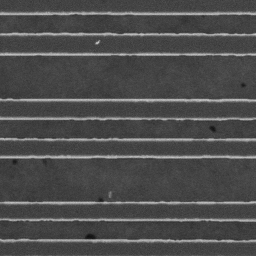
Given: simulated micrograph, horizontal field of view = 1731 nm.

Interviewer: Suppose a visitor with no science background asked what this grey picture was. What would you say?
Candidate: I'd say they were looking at lines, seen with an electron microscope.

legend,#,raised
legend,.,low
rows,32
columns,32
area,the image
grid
################################
################################
................................
................................
################################
################################
################################
................................
................................
................................
................................
................................
................................
################################
################################
................................
................................
################################
################################
################################
................................
................................
................................
................................
................................
################################
################################
................#.....#.#.######
................................
................................
################################
################################